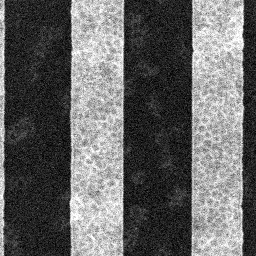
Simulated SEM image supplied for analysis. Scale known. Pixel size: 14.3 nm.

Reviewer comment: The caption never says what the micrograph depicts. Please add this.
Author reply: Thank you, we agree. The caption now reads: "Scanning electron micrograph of one or a few lines or trenches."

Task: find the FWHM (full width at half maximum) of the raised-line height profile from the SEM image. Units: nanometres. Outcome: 664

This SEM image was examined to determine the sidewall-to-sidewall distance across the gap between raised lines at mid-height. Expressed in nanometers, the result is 992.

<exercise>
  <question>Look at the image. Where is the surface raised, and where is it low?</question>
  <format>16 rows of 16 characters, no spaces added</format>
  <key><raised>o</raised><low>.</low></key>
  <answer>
.....ooo....ooo.
.....ooo....ooo.
.....ooo....ooo.
.....ooo....ooo.
.....ooo....ooo.
.....ooo....ooo.
....oooo....ooo.
....oooo....ooo.
.....ooo....ooo.
.....ooo....ooo.
.....ooo....ooo.
.....ooo....ooo.
.....ooo....ooo.
....oooo....ooo.
....oooo....ooo.
.....ooo....ooo.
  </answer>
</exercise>